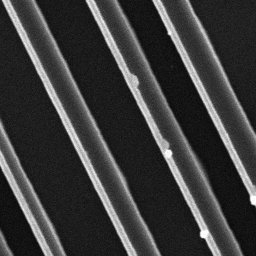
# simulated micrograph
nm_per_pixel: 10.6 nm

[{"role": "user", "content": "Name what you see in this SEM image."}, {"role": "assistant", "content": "lines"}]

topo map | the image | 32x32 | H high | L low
LHHHLLLLLLLHHHHLLLLHHHHHLLLLLLLL
LHHHHLLLLLLLHHHLLLLLHHHHLLLLLLLL
LLHHHLLLLLLLHHHHLLLLHHHHHLLLLLLL
LLHHHHLLLLLLLHHHLLLLLHHHHLLLLLLL
LLLHHHLLLLLLLHHHHLLLLHHHHHLLLLLL
LLLHHHHLLLLLLHHHHLLLLLHHHHLLLLLL
LLLHHHHLLLLLLLHHHHLLLLHHHHHLLLLL
LLLLHHHHLLLLLLHHHHLLLLLHHHHLLLLL
LLLLHHHHLLLLLLLHHHHLLLLHHHHHLLLL
LLLLLHHHHLLLLLLHHHHLLLLLHHHHLLLL
LLLLLHHHHLLLLLLLHHHHLLLLHHHHHLLL
LLLLLLHHHHLLLLLLLHHHLLLLLHHHHLLL
LLLLLLLHHHLLLLLLLHHHHLLLLHHHHLLL
LLLLLLLHHHHLLLLLLLHHHLLLLLHHHHLL
LLLLLLLLHHHLLLLLLLHHHHLLLLHHHHLL
LLLLLLLLHHHHLLLLLLLHHHLLLLLHHHHL
LLLLLLLLHHHHLLLLLLLHHHHLLLLHHHHH
HLLLLLLLLHHHHLLLLLLHHHHLLLLLHHHH
HLLLLLLLLHHHHLLLLLLLHHHHLLLLHHHH
HHLLLLLLLLHHHHLLLLLLHHHHLLLLLHHH
HHLLLLLLLLHHHHLLLLLLLHHHLLLLLHHH
HHHLLLLLLLLHHHHLLLLLLLHHHLLLLLHH
LHHLLLLLLLLHHHHLLLLLLLHHHHLLLLHH
LHHHLLLLLLLLHHHHLLLLLLLHHHLLLLLH
LLHHLLLLLLLLHHHHLLLLLLLHHHHLLLLH
LLHHHLLLLLLLLHHHHLLLLLLLHHHLLLLL
LLLHHLLLLLLLLHHHHLLLLLLLHHHHLLLL
LLLHHHLLLLLLLLHHHHLLLLLLHHHHLLLL
LLLLHHLLLLLLLLHHHHLLLLLLLHHHHLLL
LLLLHHHLLLLLLLLHHHHLLLLLLHHHHLLL
HLLLLHHLLLLLLLLHHHHLLLLLLLHHHHLL
HLLLLHHHLLLLLLLLHHHHLLLLLLHHHHLL